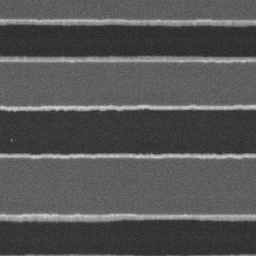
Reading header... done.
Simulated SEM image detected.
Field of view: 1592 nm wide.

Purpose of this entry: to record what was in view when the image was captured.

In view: lines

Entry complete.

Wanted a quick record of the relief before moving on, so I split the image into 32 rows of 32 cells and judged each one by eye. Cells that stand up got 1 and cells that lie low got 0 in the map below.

11111111111111111111111111111111
11111111111111111111111111111111
11111111111111111111111111111111
00000000000000000000000000000000
00000000000000000000000000000000
00000000000000000000000000000000
00000000000000000000000000000000
00000000000000000000000000000000
11111111111111111111111111111111
11111111111111111111111111111111
11111111111111111111111111111111
11111111111111111111111111111111
11111111111111111111111111111111
11111111111111111000011100000000
00000000000000000000000000000000
00000000000000000000000000000000
00000000000000000000000000000000
00000000000000000000000000000000
00000000000000000000000000000000
00000000000011101000010000000010
11111111111111111111111111111111
11111111111111111111111111111111
11111111111111111111111111111111
11111111111111111111111111111111
11111111111111111111111111111111
11111111111111111111111111111111
11111111111111111111111111111111
00000000000000000000000000000000
00000000000000000000000000000000
00000000000000000000000000000000
00000000000000000000000000000000
00000000000000000000000000000000